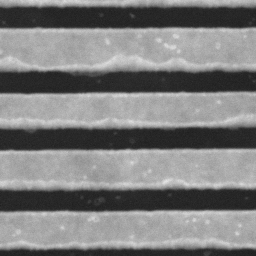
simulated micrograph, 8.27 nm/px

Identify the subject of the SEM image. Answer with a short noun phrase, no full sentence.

lines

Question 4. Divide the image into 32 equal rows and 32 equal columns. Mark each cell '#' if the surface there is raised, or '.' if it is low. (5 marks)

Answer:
################################
................................
................................
....##............###########.##
################################
################################
################################
################################
################################
................................
................................
................................
################################
################################
################################
################################
................................
................................
................................
################################
################################
################################
################################
#####################..#####..##
................................
................................
################################
################################
################################
################################
################################
................................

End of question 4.